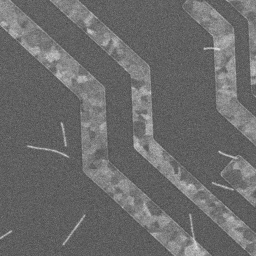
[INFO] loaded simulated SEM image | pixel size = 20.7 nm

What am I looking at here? groups of lines, slits or small figures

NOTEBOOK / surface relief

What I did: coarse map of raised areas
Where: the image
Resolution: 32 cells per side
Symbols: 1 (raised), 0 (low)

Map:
11000001110000000000000111000111
11100000111000000000000111100011
11110000011100000000000011110001
11111000001111000000000000111001
00111100000111100000000000111001
00011110000011110000000000011001
00001111000001111000000000011001
00000111100000111100000000011001
00000011110000011110000000011001
00000001111100001110000000011001
00000000111110001110000000011001
00000000011110000110000000011100
00000000001110000110000000011100
00000000001110000110000000011110
00000000001110000110000000001111
00000000001110000110000000000111
00000000001110000110000000000011
00000000001110000110000000000001
00000000001110000111000000000000
00000000001110000011100000000000
00000000001111000001110000000110
00000000000111100000111100001111
00000000000011110000011110001111
00000000000001111000001111000111
00000000000000111100000111100011
00000000000000011110000011110001
00000000000000001111000000111000
00000000000000000111110000011100
00000000000000000011111000001110
00000000000000000001111100000111
00000000000000000000111110000011
00000000000000000000011111000001